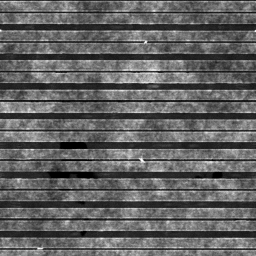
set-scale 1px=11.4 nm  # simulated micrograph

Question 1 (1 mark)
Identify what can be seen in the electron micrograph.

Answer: parallel lines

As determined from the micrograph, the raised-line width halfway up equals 107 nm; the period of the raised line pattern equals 169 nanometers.